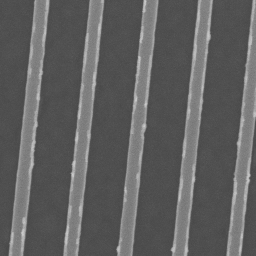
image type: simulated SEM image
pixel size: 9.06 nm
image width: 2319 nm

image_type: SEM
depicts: parallel lines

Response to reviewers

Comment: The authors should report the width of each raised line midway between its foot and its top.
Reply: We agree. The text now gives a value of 0.131 µm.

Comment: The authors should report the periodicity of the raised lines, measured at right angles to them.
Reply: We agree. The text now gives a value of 54.2 pixels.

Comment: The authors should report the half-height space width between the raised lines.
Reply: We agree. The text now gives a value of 39.7 px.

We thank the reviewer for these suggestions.